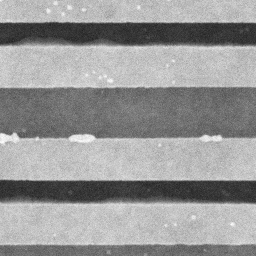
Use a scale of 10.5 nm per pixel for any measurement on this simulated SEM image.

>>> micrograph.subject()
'lines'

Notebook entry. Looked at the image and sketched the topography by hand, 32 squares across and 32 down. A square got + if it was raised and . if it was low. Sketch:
++++++++++++++++++++++++++++++++
++++++++++++++++++++++++++++++++
++++++++++++++++++++++++++++++++
................................
................................
...++++++...++..................
++++++++++++++++++++++++++++++++
++++++++++++++++++++++++++++++++
++++++++++++++++++++++++++++++++
++++++++++++++++++++++++++++++++
++++++++++++++++++++++++++++++++
................................
................................
................................
................................
................................
................................
++++++++++++++++++++++++++++++++
++++++++++++++++++++++++++++++++
++++++++++++++++++++++++++++++++
++++++++++++++++++++++++++++++++
++++++++++++++++++++++++++++++++
................................
................................
................................
++++++++++++++++++++++++++++++++
++++++++++++++++++++++++++++++++
++++++++++++++++++++++++++++++++
++++++++++++++++++++++++++++++++
++++++++++++++++++++++++++++++++
++++++++++++++++++.+++.+++..+++.
................................